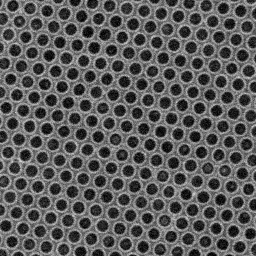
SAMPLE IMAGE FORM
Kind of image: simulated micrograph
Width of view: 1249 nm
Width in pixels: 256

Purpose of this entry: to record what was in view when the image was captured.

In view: a regular array of holes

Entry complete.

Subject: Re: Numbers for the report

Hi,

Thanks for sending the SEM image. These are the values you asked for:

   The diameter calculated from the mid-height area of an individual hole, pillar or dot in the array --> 61.6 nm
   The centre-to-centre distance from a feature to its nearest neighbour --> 81.9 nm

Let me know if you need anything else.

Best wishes